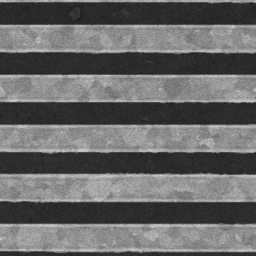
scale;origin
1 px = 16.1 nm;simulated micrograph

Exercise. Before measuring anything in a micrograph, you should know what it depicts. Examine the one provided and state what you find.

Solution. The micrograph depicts lines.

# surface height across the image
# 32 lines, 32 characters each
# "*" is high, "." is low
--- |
................................
................................
................................
********************************
********************************
********************************
................................
................................
................................
********************************
********************************
********************************
********************************
................................
................................
................................
********************************
********************************
********************************
................................
................................
................................
********************************
********************************
********************************
................................
................................
................................
********************************
********************************
********************************
................................